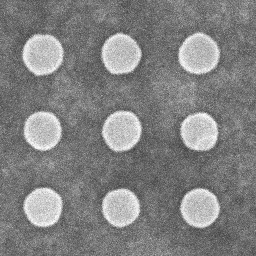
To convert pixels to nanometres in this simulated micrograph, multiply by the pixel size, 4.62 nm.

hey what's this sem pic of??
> a regular array of raised bodies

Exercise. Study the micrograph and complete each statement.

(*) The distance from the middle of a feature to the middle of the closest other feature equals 0.354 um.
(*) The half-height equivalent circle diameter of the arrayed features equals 176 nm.